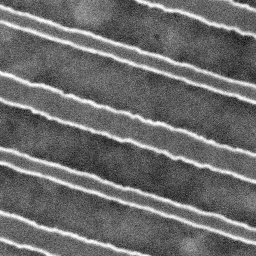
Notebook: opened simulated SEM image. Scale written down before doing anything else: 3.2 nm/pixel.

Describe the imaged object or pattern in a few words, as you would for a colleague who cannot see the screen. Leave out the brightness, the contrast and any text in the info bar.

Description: lines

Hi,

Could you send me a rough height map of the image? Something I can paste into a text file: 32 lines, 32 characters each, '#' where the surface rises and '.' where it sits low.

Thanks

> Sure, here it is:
..................############..
##....................##########
######...................#######
..######....................####
.....#######....................
.........######.................
...........#######..............
...............######...........
..................#######.......
##...................######.....
####....................#######.
########...................#####
##########....................##
....##########..................
......###########...............
.........###########............
............###########.........
...............###########......
...................##########...
####.................###########
#######.................########
...#######..................####
......#######..................#
..........######................
.............#######............
................######..........
...................######.......
###...................#######...
######...................######.
##########...................###
..###########...................
.....###########................